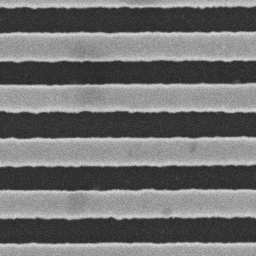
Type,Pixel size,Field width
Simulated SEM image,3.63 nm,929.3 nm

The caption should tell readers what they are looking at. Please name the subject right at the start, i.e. lines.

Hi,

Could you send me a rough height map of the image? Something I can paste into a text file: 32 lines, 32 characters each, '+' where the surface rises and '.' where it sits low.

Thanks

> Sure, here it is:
++++++++++++++++++++++++++++++++
................................
................................
................................
++++++++++++++++++++++++++++++++
++++++++++++++++++++++++++++++++
++++++++++++++++++++++++++++++++
++++++++++++++++++++++++++++++++
................................
................................
.........................+.....+
++++++++++++++++++++++++++++++++
++++++++++++++++++++++++++++++++
++++++++++++++++++++++++++++++++
................................
................................
................................
++++++++++++++++++++++++++++++++
++++++++++++++++++++++++++++++++
++++++++++++++++++++++++++++++++
++++++++++++++++++++++++++++++++
................................
................................
................................
++++++++++++++++++++++++++++++++
++++++++++++++++++++++++++++++++
++++++++++++++++++++++++++++++++
................................
................................
................................
++++++++++++++++++++++++++++++++
++++++++++++++++++++++++++++++++